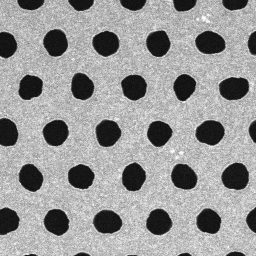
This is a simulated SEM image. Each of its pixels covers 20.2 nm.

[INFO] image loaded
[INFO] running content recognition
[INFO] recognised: a regular array of holes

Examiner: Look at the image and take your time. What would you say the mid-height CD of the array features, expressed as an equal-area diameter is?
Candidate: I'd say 0.522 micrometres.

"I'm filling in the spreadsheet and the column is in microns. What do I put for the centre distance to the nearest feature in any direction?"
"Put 1.02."